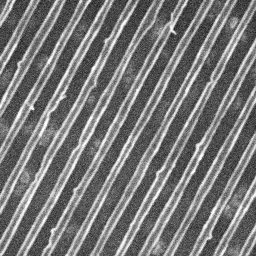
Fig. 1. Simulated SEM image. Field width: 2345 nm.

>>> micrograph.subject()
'parallel lines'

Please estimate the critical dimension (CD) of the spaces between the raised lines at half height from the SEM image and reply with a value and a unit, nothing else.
123 nm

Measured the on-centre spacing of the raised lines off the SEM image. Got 198 nanometers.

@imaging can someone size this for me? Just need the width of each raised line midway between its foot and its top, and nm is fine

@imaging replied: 69.6